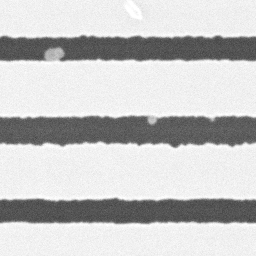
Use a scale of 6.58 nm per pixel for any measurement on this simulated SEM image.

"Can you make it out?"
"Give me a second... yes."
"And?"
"lines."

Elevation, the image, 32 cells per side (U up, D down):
UUUUUUUUUUUUUUUUUUUUUUUUUUUUUUUU
UUUUUUUUUUUUUUUUUUUUUUUUUUUUUUUU
UUUUUUUUUUUUUUUUUUUUUUUUUUUUUUUU
UUUUUUUUUUUUUUUUUUUUUUUUUUUUUUUU
DUUUUUUUUUDDUUUUUDUUUUUDUUUDUUUU
DDDDDDDDDDDDDDDDDDDDDDDDDDDDDDDD
DDDDDDDDDDDDDDDDDDDDDDDDDDDDDDDD
DDDDDDDDDDDDDDDDDDDDDDDDDDDDDDDD
UUUUUUUUUUUUUUUUUUUUUUUUUUUUUUUU
UUUUUUUUUUUUUUUUUUUUUUUUUUUUUUUU
UUUUUUUUUUUUUUUUUUUUUUUUUUUUUUUU
UUUUUUUUUUUUUUUUUUUUUUUUUUUUUUUU
UUUUUUUUUUUUUUUUUUUUUUUUUUUUUUUU
UUUUUUUUUUUUUUUUUUUUUUUUUUUUUUUU
UUUUUUUUUUUDDUUDDDDUUDDUDUUUDDDU
DDDDDDDDDDDDDDDDDDDDDDDDDDDDDDDD
DDDDDDDDDDDDDDDDDDDDDDDDDDDDDDDD
DDDDDDDDDDDDDDDDDDDDDDDDDDDDDDDD
UUUUUUUUUUUUUUUUUUUUUUUUUUUUUUUU
UUUUUUUUUUUUUUUUUUUUUUUUUUUUUUUU
UUUUUUUUUUUUUUUUUUUUUUUUUUUUUUUU
UUUUUUUUUUUUUUUUUUUUUUUUUUUUUUUU
UUUUUUUUUUUUUUUUUUUUUUUUUUUUUUUU
UUUUUUUUUUUUUUUUUUUUUUUUUUUUUUUU
UUUUUUUUUUUUUUUUUUUUUUUUUUUUUUUU
DDDDDDDDDDDDDDDDDDDDDDDDDDDDDDDD
DDDDDDDDDDDDDDDDDDDDDDDDDDDDDDDD
DDDDDDDDDDDDDDDDDDDDDDDDDDDDDDDD
UUUUUUUUUUUUUUUUUUUUUUUUUUUUUUUU
UUUUUUUUUUUUUUUUUUUUUUUUUUUUUUUU
UUUUUUUUUUUUUUUUUUUUUUUUUUUUUUUU
UUUUUUUUUUUUUUUUUUUUUUUUUUUUUUUU